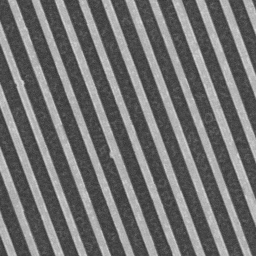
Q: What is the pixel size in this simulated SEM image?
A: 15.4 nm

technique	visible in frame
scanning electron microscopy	parallel lines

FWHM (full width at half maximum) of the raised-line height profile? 119 nanometers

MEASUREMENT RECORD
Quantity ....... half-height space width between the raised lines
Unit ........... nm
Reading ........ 224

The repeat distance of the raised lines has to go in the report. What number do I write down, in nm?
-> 341